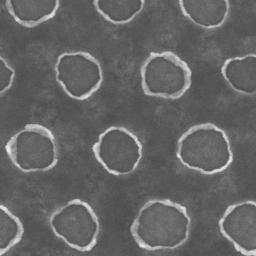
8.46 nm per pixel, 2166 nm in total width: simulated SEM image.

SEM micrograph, holes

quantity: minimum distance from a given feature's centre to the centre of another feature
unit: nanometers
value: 720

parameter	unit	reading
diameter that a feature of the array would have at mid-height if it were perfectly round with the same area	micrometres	0.354